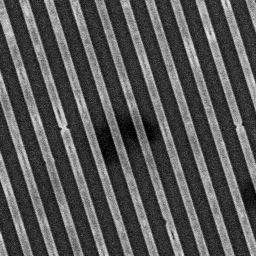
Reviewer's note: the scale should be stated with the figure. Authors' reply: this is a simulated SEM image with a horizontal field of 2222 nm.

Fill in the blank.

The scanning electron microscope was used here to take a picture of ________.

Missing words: parallel lines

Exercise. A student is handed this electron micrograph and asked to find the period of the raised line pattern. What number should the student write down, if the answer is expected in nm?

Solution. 208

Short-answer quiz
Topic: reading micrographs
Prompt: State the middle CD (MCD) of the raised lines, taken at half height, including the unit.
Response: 74.5 nanometers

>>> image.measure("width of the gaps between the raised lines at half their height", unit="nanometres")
134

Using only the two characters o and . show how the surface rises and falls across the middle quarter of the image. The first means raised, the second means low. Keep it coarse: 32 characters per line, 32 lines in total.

oo.....oo....oo....oo.....oo....
.oo....oo....oo.....oo....oo....
.oo....oo.....oo....oo....oo....
.oo.....oo....oo....oo....oo....
..oo....oo....oo....ooo....oo...
..oo....oo....ooo....oo....oo...
..oo....oo.....oo....oo....oo...
..oo.....oo....oo....ooo....oo..
...oo....oo....ooo....oo....oo..
...oo....oo.....oo....oo....ooo.
...oo.....oo....oo....ooo....oo.
....oo....oo....ooo....oo....oo.
....oo....oo.....oo....oo....oo.
....oo.....oo....oo....ooo....oo
o....oo....oo....ooo....oo....oo
o....oo....oo.....oo....oo....oo
o....oo.....oo....oo....ooo....o
oo....oo....oo....ooo....oo....o
oo....oo....oo.....oo....oo....o
oo....oo.....oo....oo....oo.....
ooo....oo....oo....oo.....oo....
.oo....oo....oo.....oo....oo....
.oo....oo.....oo....oo....oo....
.oo.....oo....oo....oo....ooo...
..oo....oo....oo....ooo....oo...
..oo....oo....oo.....oo....oo...
..oo....oo.....oo....oo....ooo..
..ooo....oo....oo....ooo....oo..
...oo....oo....oo.....oo....oo..
...oo....oo.....oo....oo....oo..
...ooo....oo....oo....ooo....oo.
....oo....oo....oo.....oo....oo.